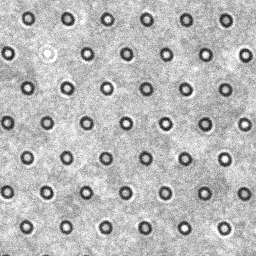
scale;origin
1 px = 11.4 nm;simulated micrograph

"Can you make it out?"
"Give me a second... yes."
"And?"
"a regular array of ring-shaped grooves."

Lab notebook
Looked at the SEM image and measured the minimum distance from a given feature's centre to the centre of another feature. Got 0.45 micrometres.